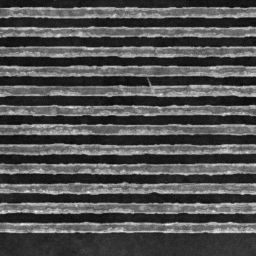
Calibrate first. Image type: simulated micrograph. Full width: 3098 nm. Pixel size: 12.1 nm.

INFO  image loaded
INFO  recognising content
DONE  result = parallel lines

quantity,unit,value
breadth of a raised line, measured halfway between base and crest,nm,104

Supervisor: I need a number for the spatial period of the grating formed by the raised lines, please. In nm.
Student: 236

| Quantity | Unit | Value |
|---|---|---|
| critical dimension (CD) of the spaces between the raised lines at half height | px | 11.5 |